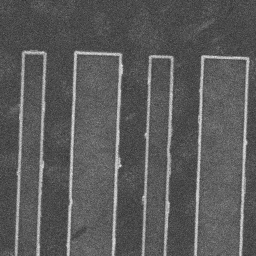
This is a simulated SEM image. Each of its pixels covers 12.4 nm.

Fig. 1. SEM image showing one or a few lines or trenches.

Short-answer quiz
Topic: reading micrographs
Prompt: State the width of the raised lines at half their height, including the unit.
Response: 384 nanometres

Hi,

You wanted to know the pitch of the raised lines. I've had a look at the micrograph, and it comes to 793 nm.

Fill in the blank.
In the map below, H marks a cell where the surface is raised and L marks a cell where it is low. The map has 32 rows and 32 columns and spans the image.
HHHHHHHHHHHHHHHHHHHHHHHHHHHHHHHH
HHHHHHHHHHHHHHHHHHHHHHHHHHHHHHHH
HHHHHHHHHHHHHHHHHHHHHHHHHHHHHHHH
HHHHHHHHHHHHHHHHHHHHHHHHHHHHHHHH
HHHHHHHHHHHHHHHHHHHHHHHHHHHHHHHH
HHHHHHHHHHHHHHHHHHHHHHHHHHHHHHHH
HHHHHHHHHHHHHHHHHHHHHHHHHHHHHHHH
HHHLLLHHHLLLLLLHHHHLLHHHHLLLLLLH
HHHLLLHHHLLLLLLHHHHLLLHHHLLLLLLH
HHHLLLHHHLLLLLLHHHHLLHHHHLLLLLLH
HHHLLLHHHLLLLLLHHHHLLHHHHLLLLLLH
HHHLLLHHHLLLLLLHHHHLLHHHHLLLLLLH
HHHLLHHHHLLLLLLHHHHLLHHHHLLLLLLH
HHHLLHHHHLLLLLLHHHHLLHHHHLLLLLLH
HHHLLHHHHLLLLLLHHHLLLHHHHLLLLLLH
HHHLLHHHHLLLLLLHHHLLLHHHHLLLLLLH
HHHLLHHHHLLLLLLHHHLLLHHHHLLLLLLH
HHLLLHHHHLLLLLLHHHLLLHHHHLLLLLLH
HHHLLHHHHLLLLLLHHHLLLHHHHLLLLLLH
HHLLLHHHHLLLLLLHHHLLLHHHHLLLLLLH
HHLLLHHHHLLLLLLHHHLLLHHHHLLLLLHH
HHLLLHHHHLLLLLLHHHLLLHHHHLLLLLHH
HHLLLHHHHLLLLLLHHHLLLHHHHLLLLLHH
HHLLLHHHHLLLLLHHHHLLLHHHHLLLLLHH
HHLLLHHHHLLLLLHHHHLLLHHHHLLLLLHH
HHLLLHHHHLLLLLHHHHLLLHHHHLLLLLHH
HHLLLHHHHLLLLLHHHHLLLHHHHLLLLLHH
HHLLLHHHHLLLLLHHHHLLLHHHHLLLLLHH
HHLLLHHHHLLLLLHHHHLLLHHHHLLLLLHH
HHLLLHHHHLLLLLHHHHLLLHHHHLLLLLHH
HHLLLHHHHLLLLLHHHHLLLHHHLLLLLLHH
HHLLLHHHHLLLLLHHHHLLLHHHLLLLLLHH